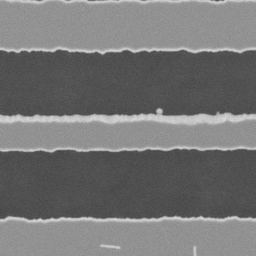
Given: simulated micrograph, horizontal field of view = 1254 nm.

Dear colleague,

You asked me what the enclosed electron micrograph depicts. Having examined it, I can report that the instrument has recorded lines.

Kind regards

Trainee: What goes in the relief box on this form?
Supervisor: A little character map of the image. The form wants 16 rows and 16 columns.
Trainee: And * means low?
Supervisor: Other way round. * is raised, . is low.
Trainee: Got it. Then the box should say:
****************
****************
****************
................
................
................
................
****************
****************
................
................
................
................
................
****************
****************